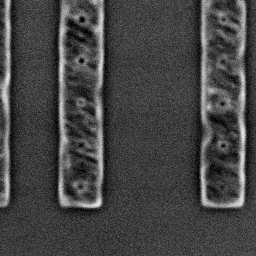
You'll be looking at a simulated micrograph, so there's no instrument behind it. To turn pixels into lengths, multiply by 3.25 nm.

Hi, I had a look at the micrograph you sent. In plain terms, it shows wiring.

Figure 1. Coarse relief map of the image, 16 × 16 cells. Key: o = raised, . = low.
o...oo.......oo.
o...oo.......oo.
o...oo.......oo.
o...oo.......oo.
o...oo.......oo.
....oo.......oo.
....oo.......oo.
....oo.......oo.
....oo.......oo.
....oo.......oo.
....oo.......oo.
....oo.......oo.
....oo.......oo.
................
................
................